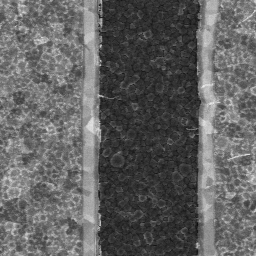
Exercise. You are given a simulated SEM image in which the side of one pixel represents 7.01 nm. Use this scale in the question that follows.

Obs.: one or a few lines or trenches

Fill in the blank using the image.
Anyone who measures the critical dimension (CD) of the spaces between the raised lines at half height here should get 119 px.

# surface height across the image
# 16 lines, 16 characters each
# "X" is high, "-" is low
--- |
XXXXXX-------XXX
XXXXXX-------XXX
XXXXXX-------XXX
XXXXXX-------XXX
XXXXXX-------XXX
XXXXXX-------XXX
XXXXXX-------XXX
XXXXX--------XXX
XXXXXX-------XXX
XXXXXX-------XXX
XXXXXX-------XXX
XXXXXX-------XXX
XXXXXX-------XXX
XXXXXX-------XXX
XXXXXX-------XXX
XXXXXX-------XXX